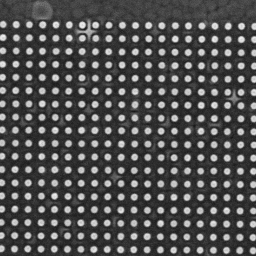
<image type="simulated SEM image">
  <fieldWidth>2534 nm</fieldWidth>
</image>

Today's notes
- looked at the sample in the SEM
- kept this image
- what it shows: a regular array of raised bodies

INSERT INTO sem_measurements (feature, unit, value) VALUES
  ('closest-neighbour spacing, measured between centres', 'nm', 128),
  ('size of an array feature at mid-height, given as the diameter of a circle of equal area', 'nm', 62.2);